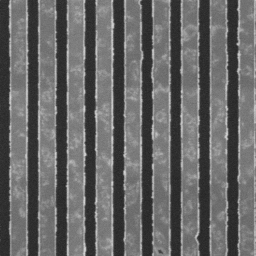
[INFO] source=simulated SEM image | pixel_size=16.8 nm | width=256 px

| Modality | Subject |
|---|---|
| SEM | parallel lines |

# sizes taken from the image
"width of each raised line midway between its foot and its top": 0.295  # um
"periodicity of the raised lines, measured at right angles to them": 28.5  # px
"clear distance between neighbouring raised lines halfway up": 187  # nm